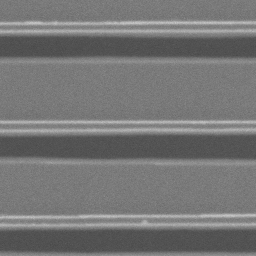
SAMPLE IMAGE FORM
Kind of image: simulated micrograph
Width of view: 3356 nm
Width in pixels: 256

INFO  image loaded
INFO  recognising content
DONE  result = lines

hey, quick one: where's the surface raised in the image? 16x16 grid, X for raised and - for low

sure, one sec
XXXXXXXXXXXXXXXX
XXXXXXXXXXXXXXXX
----------------
----------------
XXXXXXXXXXXXXXXX
XXXXXXXXXXXXXXXX
XXXXXXXXXXXXXXXX
XXXXXXXXXXXXXXXX
----------------
----------------
XXXXXXXXXXXXXXXX
XXXXXXXXXXXXXXXX
XXXXXXXXXXXXXXXX
XXXXXXXXXXXXXXXX
----------------
----------------